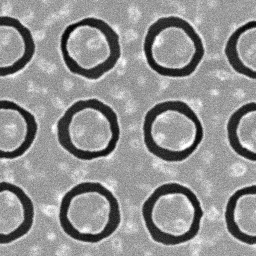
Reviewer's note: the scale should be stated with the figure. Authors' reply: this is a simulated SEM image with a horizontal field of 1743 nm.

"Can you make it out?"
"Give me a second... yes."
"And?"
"ring-shaped grooves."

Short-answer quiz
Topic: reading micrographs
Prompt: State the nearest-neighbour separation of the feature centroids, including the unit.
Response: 554 nm